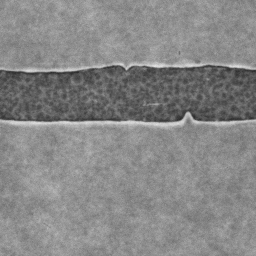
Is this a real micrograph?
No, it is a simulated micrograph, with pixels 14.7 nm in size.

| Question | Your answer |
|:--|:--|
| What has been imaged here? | one or a few lines or trenches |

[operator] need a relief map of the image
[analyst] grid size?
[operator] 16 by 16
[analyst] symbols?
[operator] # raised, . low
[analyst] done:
################
################
################
################
................
................
................
...........#....
################
################
################
################
################
################
################
################